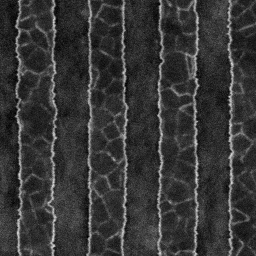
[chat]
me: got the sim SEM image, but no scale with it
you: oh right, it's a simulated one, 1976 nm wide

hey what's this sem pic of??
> one or a few lines or trenches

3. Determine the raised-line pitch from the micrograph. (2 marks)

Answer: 547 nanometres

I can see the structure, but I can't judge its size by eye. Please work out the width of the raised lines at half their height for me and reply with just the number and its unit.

35.6 px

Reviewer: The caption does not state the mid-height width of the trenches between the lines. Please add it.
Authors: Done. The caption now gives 0.268 microns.